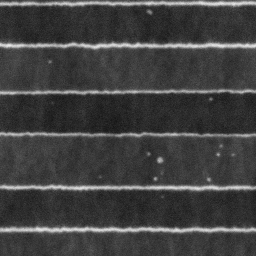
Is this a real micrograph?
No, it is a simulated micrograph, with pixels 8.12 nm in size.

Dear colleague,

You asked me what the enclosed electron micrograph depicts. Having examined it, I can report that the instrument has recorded lines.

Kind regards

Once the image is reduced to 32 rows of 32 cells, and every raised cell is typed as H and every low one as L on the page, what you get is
LLHLLLLLLLLLLLLLLLLLLLLLLLLLLLLL
LLLLLLLLLLLLLLLLLLLLLLLLLLLLLLLL
LLLLLLLLLLLLLLLLLLLLLLLLLLLLLLLL
LLLLLLLLLLLLLLLLLLLLLLLLLLLLLLLL
LLLLLLLLLLLLLLLLLLLLLLLLLLLLLLLL
LLLLLLLLLLLLLLLLLLLLLLLLLLLLLLLL
HHHHHHHHHHHHHHHHHHHHHHHHHHHHHHHH
HHHHHHHHHHHHHHHHHHHHHHHHHHHHHHHH
HHHHHHHHHHHHHHHHHHHHHHHHHHHHHHHH
HHHHHHHHHHHHHHHHHHHHHHHHHHHHHHHH
HHHHHHHHHHHHHHHHHHHHHHHHHHHHHHHH
HHHHHHHHHHHHHHHHHHLHHLLLLLLLLHHL
LLLLLLLLLLLLLLLLLLLLLLLLLLLLLLLL
LLLLLLLLLLLLLLLLLLLLLLLLLLLLLLLL
LLLLLLLLLLLLLLLLLLLLLLLLLLLLLLLL
LLLLLLLLLLLLLLLLLLLLLLLLLLLLLLLL
LLLLLLLLLLLLLLLLLLLLLLLLLLLLLLLL
HHHHHHHHHHHHHHHHHHHHHHHHHHHHHHHH
HHHHHHHHHHHHHHHHHHHHHHHHHHHHHHHH
HHHHHHHHHHHHHHHHHHHHHHHHHHHHHHHH
HHHHHHHHHHHHHHHHHHHHHHHHHHHHHHHH
HHHHHHHHHHHHHHHHHHHHHHHHHHHHHHHH
HHHHHHHHHHHHHHHHHHHHHHHHHHHHHHHH
LLLLLLLLLLHLLLLLLLLLLLLLHHLHLLLL
LLLLLLLLLLLLLLLLLLLLLLLLLLLLLLLL
LLLLLLLLLLLLLLLLLLLLLLLLLLLLLLLL
LLLLLLLLLLLLLLLLLLLLLLLLLLLLLLLL
LLLLLLLLLLLLLLLLLLLLLLLLLLLLLLLL
LLLLLLLLLLLLLLLLLLLLLLLLLLLLLLLL
HHHHHHHHHHHHHHHHHHHHHHHHHHHHHHHH
HHHHHHHHHHHHHHHHHHHHHHHHHHHHHHHH
HHHHHHHHHHHHHHHHHHHHHHHHHHHHHHHH